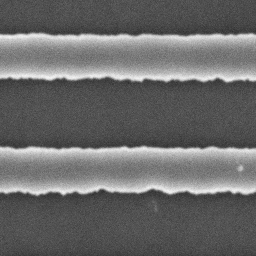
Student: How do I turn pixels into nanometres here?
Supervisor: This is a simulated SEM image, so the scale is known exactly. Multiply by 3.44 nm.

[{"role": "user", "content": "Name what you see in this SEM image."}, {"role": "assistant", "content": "lines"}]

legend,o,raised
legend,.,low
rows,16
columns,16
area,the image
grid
................
................
oooooooooooooooo
oooooooooooooooo
oooooooooooooooo
................
................
................
................
oooooooooooooooo
oooooooooooooooo
oooooooooooooooo
................
................
................
................